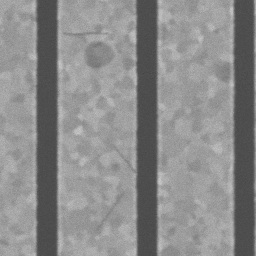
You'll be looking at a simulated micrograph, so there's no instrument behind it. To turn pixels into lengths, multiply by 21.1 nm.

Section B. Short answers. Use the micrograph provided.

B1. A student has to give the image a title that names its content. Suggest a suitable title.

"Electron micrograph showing lines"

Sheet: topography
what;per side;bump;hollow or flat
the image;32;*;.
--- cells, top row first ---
*****..**********...*********...
*****..**********...*********...
*****..**********...*********...
*****..**********...*********...
*****..**********...*********...
*****..**********...*********...
*****..**********...*********...
*****..**********...*********...
*****..**********...*********...
*****..**********...*********...
*****..**********...*********...
*****..**********...*********...
*****..**********...*********...
*****..**********...*********...
*****..**********...*********...
*****..**********...*********...
*****..**********...*********...
*****..**********...*********...
*****..**********...*********...
*****..**********...*********...
*****..**********...*********...
*****..**********...*********...
*****..**********...*********...
*****..**********...*********...
*****..**********...*********...
*****..**********...*********...
*****..**********...*********...
*****..**********...*********...
*****..**********...*********...
*****..**********...*********...
*****..**********...*********...
*****..**********...*********...